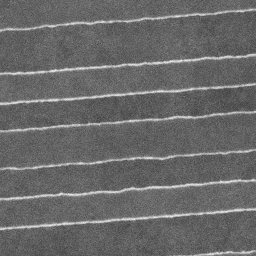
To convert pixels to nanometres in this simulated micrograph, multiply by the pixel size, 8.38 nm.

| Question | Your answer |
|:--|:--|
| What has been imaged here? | lines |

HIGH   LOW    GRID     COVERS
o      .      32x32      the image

oooooooooooooooooooooooooooooooo
ooooooooooooooooooooooooooooo...
oooooooooooooooooo..............
ooooo...........................
................................
................................
................................
........................oooooooo
...........ooooooooooooooooooooo
oooooooooooooooooooooooooooooooo
oooooooooooooooooooooooooooooooo
oooooooooooooooooooo............
ooooooo.........................
................................
.........................ooooooo
............oooooooooooooooooooo
oooooooooooooooooooooooooooooooo
oooooooooooooooooooooooooooooooo
oooooooooooooooooooooooooooooooo
oooooooooooooooooooooo..........
ooooooooo.......................
................................
...............................o
..................oooooooooooooo
.....ooooooooooooooooooooooooooo
oooooooooooooooooooooooooooooooo
oooooooooooooooooooooooooooo....
ooooooooooooooo.................
oo..............................
................................
................................
...............................o